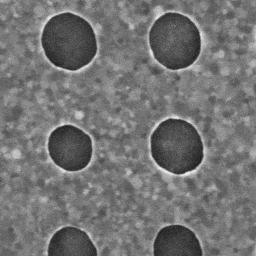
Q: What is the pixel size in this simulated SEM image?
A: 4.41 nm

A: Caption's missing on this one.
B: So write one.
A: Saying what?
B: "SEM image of holes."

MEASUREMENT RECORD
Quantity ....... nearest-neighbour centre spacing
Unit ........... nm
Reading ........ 466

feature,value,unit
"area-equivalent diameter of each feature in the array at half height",244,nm